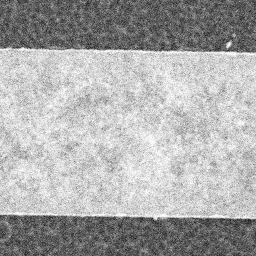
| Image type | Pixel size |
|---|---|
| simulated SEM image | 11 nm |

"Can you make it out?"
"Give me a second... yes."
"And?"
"one or a few lines or trenches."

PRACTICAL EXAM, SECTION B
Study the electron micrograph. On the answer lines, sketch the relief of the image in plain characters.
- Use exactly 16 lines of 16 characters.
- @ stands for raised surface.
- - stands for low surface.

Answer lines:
----------------
----------------
---@------------
@@@@@@@@@@@@@@@@
@@@@@@@@@@@@@@@@
@@@@@@@@@@@@@@@@
@@@@@@@@@@@@@@@@
@@@@@@@@@@@@@@@@
@@@@@@@@@@@@@@@@
@@@@@@@@@@@@@@@@
@@@@@@@@@@@@@@@@
@@@@@@@@@@@@@@@@
@@@@@@@@@@@@@@@@
--------@@@@@@@@
@---------------
----------------